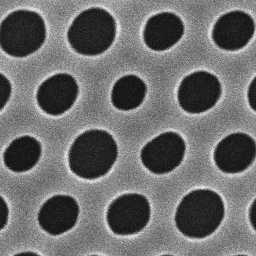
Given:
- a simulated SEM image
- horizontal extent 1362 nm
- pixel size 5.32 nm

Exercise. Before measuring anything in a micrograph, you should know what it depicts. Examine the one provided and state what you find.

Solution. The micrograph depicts a regular array of holes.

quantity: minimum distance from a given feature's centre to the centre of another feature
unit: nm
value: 371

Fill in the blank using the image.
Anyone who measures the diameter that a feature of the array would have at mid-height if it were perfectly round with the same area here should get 226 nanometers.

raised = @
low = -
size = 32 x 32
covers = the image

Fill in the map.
@@@@@@@@@@@@@@@@@@@@@@@@@@@@@@@@
@---@@@@@@---@@@@@@@@@@@@@@@@--@
-----@@@@-----@@@@-----@@@@-----
------@@@------@@@-----@@@@-----
------@@------@@@@-----@@@------
-----@@@@-----@@@@----@@@@@----@
----@@@@@----@@@@@@@@@@@@@@@@@@@
@@@@@@@@@@@@@@@@@@@@@@@@@@@@@@@@
@@@@@@@@@@@@@@@@@@@@@@@@@@@@@@@@
-@@@@@@--@@@@@@--@@@@@@----@@@@@
-@@@@-----@@@@----@@@@------@@@-
-@@@@-----@@@@----@@@@------@@@-
-@@@@-----@@@@----@@@@-----@@@@-
@@@@@----@@@@@@--@@@@@@----@@@@-
@@@@@@@@@@@@@@@@@@@@@@@@@@@@@@@@
@@@@@@@@@@@@@@@@@@@@@@@@@@@@@@@@
@@@@@@@@@@---@@@@@@@@-@@@@@@@@@@
@@---@@@@-----@@@@@----@@@@@----
@----@@@@------@@@-----@@@@-----
-----@@@-------@@@-----@@@@-----
@---@@@@@-----@@@@-----@@@@-----
@@-@@@@@@-----@@@@@--@@@@@@@--@@
@@@@@@@@@@@@@@@@@@@@@@@@@@@@@@@@
@@@@@@@@@@@@@@@@@@@@@@@@@@@@@@@@
@@@@@@@--@@@@@@---@@@@@----@@@@@
-@@@@-----@@@@-----@@@------@@@-
-@@@@-----@@@------@@@------@@@-
-@@@@-----@@@------@@@------@@@-
@@@@@----@@@@@----@@@@-----@@@@@
@@@@@@@@@@@@@@@@@@@@@@@---@@@@@@
@@@@@@@@@@@@@@@@@@@@@@@@@@@@@@@@
@@@-@@@@@@@@@@@@@@@@@@@@@@@@@@@@